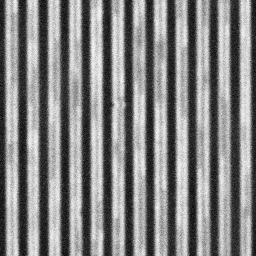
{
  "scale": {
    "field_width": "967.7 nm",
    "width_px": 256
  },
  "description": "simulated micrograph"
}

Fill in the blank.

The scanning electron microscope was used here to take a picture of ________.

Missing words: parallel lines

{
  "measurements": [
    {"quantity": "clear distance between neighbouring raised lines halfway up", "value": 43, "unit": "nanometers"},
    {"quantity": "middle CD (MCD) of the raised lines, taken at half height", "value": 0.0369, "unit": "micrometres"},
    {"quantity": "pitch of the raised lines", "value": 80.3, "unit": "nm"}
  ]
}